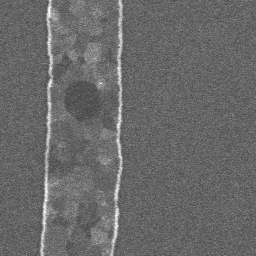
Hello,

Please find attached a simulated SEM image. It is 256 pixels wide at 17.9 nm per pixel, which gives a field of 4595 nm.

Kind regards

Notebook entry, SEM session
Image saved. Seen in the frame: one or a few lines or trenches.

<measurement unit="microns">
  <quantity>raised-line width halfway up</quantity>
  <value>1.29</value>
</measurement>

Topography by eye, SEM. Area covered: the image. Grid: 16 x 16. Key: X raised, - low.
---XXXXX--------
---XXXXX--------
---XXXXX--------
---XXXX---------
---XXXX---------
---XXXXX--------
---XXXXX--------
---XXXX---------
---XXXX---------
---XXXX---------
---XXXXX--------
---XXXX---------
---XXXX---------
---XXXX---------
---XXXX---------
---XXXX---------